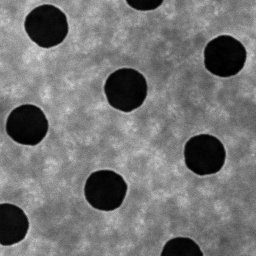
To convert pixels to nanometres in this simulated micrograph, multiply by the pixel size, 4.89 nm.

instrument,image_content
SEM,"holes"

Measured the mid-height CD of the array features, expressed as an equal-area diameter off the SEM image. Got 208 nm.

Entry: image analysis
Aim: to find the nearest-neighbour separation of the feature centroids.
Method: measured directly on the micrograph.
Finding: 0.493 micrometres